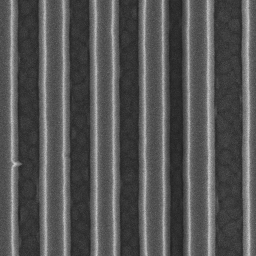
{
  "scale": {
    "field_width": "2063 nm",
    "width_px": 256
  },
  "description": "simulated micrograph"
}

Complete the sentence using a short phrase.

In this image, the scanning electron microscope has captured parallel lines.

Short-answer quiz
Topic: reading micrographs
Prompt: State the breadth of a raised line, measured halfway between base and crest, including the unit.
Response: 198 nanometres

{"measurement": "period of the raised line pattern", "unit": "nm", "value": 387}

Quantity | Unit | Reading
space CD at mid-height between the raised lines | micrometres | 0.212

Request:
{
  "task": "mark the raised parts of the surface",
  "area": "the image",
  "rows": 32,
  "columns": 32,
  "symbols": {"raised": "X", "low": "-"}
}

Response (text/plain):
XX---XXX----XX----XXX--XXX-----X
XX---XXX----XX----XXX--XXX-----X
XX---XXX----XX----XXX--XXX-----X
XX---XXX----XX----XXX--XXX-----X
XX---XXX----XX----XXX--XXX-----X
XX---XXX----XX----XXX--XXX-----X
XX---XXX----XXX---XXX--XXX-----X
XX---XXX----XXX---XXX--XXX-----X
XX---XXX----XXX---XXX--XXX-----X
XX---XXX----XXX---XXX--XXX-----X
XX---XXX----XXX---XXX--XXX-----X
XX---XXX----XXX---XXX--XXX-----X
XX---XXX----XXX---XXX--XXX-----X
XX---XXX----XXX---XXX--XXX-----X
XX---XXX----XXX---XXX--XXX-----X
XX---XXX----XXX---XXX--XXX-----X
XX---XXX----XXX---XXX--XXX-----X
XX---XXX----XX----XXX--XXX-----X
XX---XXX----XXX---XXX--XXX-----X
XX---XXX----XXX---XXX--XXX-----X
XX---XXX----XXX---XXX--XXX-----X
XX---XXX----XXX---XXX--XXX-----X
XX---XXX----XXX---XXX--XXX-----X
XX---XXX----XXX---XXX--XXX-----X
XX---XXX----XXX---XXX--XXX-----X
XX---XXX----XXX---XXX--XXX-----X
XX---XXX----XXX---XXX--XXX-----X
XX---XXX----XXX---XXX--XXX-----X
XX---XXX----XXX---XXX--XXX-----X
XX---XXX----XXX---XXX--XXX-----X
XX---XXX----XXX---XXX--XXX-----X
XX---XXX----XXX---XXX--XXX-----X